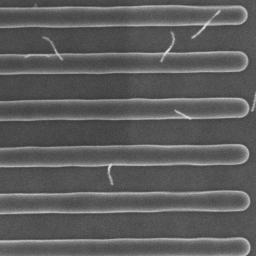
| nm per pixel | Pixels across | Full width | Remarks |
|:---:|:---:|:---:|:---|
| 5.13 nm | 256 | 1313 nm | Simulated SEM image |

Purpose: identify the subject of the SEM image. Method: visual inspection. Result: groups of lines, slits or small figures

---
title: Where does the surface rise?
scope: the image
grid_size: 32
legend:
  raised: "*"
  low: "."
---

................................
*******************************.
*******************************.
................................
................................
................................
................................
*******************************.
*******************************.
................................
................................
................................
.........*..******************..
*******************************.
******************************..
................................
................................
................................
..*****************************.
*******************************.
*********************...***.....
................................
................................
................................
*******************************.
*******************************.
**************..................
................................
................................
................................
*******************************.
*******************************.